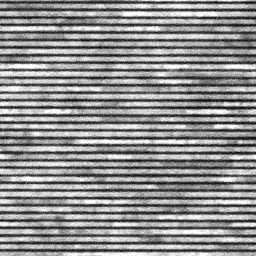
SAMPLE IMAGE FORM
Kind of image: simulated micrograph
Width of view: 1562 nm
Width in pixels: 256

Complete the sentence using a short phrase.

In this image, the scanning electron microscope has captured parallel lines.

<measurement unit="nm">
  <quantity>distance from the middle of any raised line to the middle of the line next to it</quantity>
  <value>45.9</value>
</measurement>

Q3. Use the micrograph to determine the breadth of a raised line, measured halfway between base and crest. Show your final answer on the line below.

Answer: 22.1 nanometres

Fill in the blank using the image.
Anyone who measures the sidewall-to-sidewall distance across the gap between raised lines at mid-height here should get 0.0221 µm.